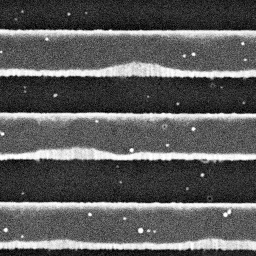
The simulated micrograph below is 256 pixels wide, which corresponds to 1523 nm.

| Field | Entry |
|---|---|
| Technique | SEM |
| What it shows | lines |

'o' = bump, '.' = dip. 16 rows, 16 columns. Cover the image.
................
................
oooooooooooooooo
oooooooooooooooo
ooooooo...oooooo
................
................
oooooooooooooooo
oooooooooooooooo
oooooooooooooooo
................
................
................
oooooooooooooooo
oooooooooooooooo
................